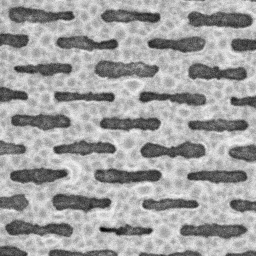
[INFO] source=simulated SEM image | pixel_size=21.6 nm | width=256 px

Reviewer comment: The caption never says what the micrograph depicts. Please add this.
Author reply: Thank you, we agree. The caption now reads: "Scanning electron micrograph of a regular array of holes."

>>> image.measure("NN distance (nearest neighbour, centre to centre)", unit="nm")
1060